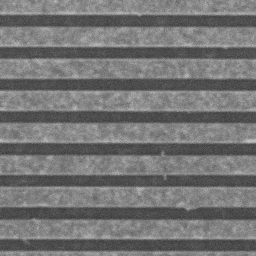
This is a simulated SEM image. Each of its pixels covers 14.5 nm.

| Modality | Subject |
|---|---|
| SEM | parallel lines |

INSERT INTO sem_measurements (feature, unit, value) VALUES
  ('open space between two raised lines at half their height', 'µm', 0.188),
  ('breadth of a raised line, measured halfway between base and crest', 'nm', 269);